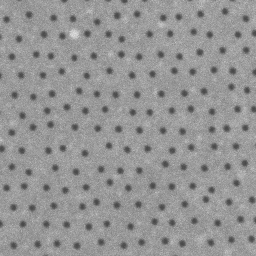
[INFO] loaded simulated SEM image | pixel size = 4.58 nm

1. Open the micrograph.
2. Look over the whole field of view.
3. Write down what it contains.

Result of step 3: a regular array of holes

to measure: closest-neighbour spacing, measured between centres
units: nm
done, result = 85.2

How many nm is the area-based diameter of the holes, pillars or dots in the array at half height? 33.1